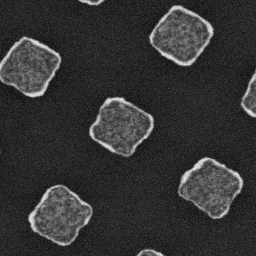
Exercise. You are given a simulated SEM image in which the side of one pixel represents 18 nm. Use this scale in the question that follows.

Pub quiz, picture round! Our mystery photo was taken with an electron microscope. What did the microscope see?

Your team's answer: raised bodies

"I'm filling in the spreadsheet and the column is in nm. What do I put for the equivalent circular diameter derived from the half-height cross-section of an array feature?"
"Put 992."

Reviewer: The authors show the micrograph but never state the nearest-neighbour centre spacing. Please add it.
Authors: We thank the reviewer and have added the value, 1.95 um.